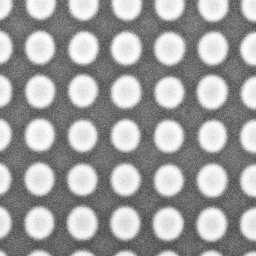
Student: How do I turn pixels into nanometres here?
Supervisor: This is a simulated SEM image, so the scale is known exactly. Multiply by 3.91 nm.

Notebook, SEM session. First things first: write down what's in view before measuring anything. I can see a regular array of raised bodies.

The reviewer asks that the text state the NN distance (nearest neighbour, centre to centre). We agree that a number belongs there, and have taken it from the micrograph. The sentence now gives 0.168 µm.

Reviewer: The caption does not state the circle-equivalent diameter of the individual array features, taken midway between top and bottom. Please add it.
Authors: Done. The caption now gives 111 nm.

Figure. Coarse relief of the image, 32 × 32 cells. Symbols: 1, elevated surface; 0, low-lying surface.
10001110011100111000111001110011
10001100011100111000111001110001
00000000000000000000000000000000
00000000000000000000000000000000
10001100001000011000110000110001
10011110011100111000111001110011
10011110011100111000111001110011
10001100011000011000110000110001
00000000000000000000000000000000
00000000000000000000000000000000
10001100011100111000110001110001
10011110011100111000111001110011
10001100011100111000111001110001
00000000000000000000000000000000
00000000000000000000000000000000
10001100011000011000110000100001
10011110011100111000111001110011
10011110011100111000111001110011
00001100011000011000110000100001
00000000000000000000000000000000
00000000000000000000000000000000
10011100011100111000110001110001
10011110011100111000111001110011
10001100011100111000110001110011
00000000000000000000000000000000
00000000000000000000000000000000
10001100011000011000110000100001
10011110011100111001111001110011
10011100011100111001111001110011
00001100011000011000110001100001
00000000000000000000000000000000
00000000000000000000000000000000